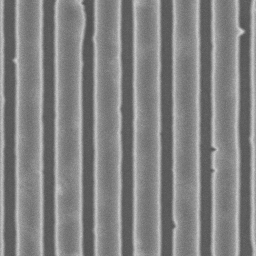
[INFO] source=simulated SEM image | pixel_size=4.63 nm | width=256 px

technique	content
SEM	parallel lines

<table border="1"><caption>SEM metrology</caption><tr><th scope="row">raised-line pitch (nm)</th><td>182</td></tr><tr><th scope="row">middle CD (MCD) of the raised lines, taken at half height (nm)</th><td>119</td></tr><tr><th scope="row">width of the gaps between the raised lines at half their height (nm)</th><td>61.3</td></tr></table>